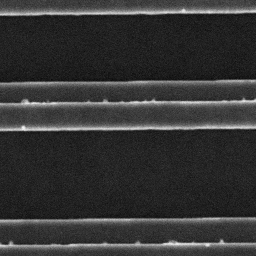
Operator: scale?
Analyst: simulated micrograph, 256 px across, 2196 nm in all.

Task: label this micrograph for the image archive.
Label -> lines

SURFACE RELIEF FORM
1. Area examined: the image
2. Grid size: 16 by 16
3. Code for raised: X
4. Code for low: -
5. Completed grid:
XXXXXXXXXXXXXXXX
----------------
----------------
----------------
----------------
XXXXXXXXXXXXXXXX
XXXXXXXXXXXXXXXX
XXXXXXXXXXXXXXXX
----------------
----------------
----------------
----------------
----------------
----------------
XXXXXXXXXXXXXXXX
XXXXXXXXXXXXXXXX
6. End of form